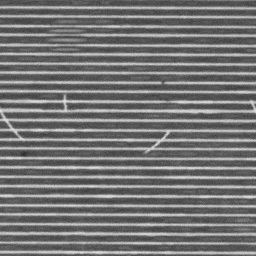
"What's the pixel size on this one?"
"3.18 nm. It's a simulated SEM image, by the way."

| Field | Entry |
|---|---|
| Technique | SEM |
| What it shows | parallel lines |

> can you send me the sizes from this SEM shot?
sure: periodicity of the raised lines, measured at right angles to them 29.9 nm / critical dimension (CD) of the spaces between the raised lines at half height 7.14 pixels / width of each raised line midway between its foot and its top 5.6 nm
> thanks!